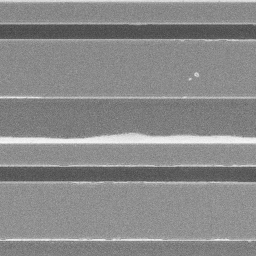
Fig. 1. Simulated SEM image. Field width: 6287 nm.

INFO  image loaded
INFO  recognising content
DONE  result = lines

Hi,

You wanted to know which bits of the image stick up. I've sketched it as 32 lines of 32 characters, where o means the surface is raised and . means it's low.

oooooooooooooooooooooooooooooooo
oooooooooooooooooooooooooooooooo
oooooooooooooooooooooooooooooooo
................................
................................
oooooooooooooooooooooooooooooooo
oooooooooooooooooooooooooooooooo
oooooooooooooooooooooooooooooooo
oooooooooooooooooooooooooooooooo
oooooooooooooooooooooooooooooooo
oooooooooooooooooooooooooooooooo
oooooooooooooooooooooooooooooooo
................................
................................
................................
................................
................................
.............oooooo.............
oooooooooooooooooooooooooooooooo
oooooooooooooooooooooooooooooooo
oooooooooooooooooooooooooooooooo
................................
................................
oooooooooooooooooooooooooooooooo
oooooooooooooooooooooooooooooooo
oooooooooooooooooooooooooooooooo
oooooooooooooooooooooooooooooooo
oooooooooooooooooooooooooooooooo
oooooooooooooooooooooooooooooooo
oooooooooooooooooooooooooooooooo
................................
................................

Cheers